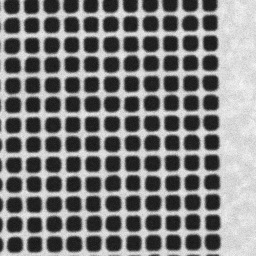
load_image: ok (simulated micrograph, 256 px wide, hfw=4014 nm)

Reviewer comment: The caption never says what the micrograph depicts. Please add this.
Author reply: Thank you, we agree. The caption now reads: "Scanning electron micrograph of a regular array of holes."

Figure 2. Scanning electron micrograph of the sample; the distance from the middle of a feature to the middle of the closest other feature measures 0.307 microns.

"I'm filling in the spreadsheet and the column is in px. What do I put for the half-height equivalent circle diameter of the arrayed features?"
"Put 17.6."